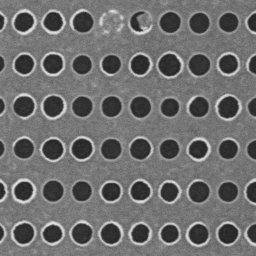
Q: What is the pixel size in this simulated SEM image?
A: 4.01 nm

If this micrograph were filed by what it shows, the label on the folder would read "a regular array of holes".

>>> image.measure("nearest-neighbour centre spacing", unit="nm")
116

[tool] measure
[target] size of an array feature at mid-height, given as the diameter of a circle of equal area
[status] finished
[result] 80.6 nanometers